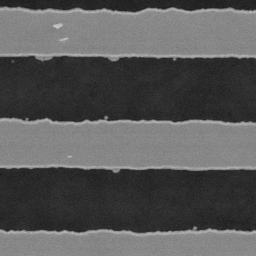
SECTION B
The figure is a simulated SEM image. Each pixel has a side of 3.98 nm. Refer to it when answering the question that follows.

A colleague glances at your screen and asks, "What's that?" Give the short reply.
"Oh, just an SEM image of lines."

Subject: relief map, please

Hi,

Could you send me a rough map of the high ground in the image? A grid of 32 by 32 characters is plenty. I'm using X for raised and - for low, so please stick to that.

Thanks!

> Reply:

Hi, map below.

--------------------------------
XXXXXXXXXXXXXXXX-XXXXXXXXXXXXXXX
XXXXXXXXXXXXXXXXXXXXXXXXXXXXXXXX
XXXXXXXXXXXXXXXXXXXXXXXXXXXXXXXX
XXXXXXXXXXXXXXXXXXXXXXXXXXXXXXXX
XXXXXXXXXXXXXXXXXXXXXXXXXXXXXXXX
XXXXXXXXXXXXXXXXXXXXXXXXXXXXXXXX
--------------------------------
--------------------------------
--------------------------------
--------------------------------
--------------------------------
--------------------------------
--------------------------------
--------------------------------
XXXXXXXXXXXXXXXXXXXXXXXXXXXXXXXX
XXXXXXXXXXXXXXXXXXXXXXXXXXXXXXXX
XXXXXXXXXXXXXXXXXXXXXXXXXXXXXXXX
XXXXXXXXXXXXXXXXXXXXXXXXXXXXXXXX
XXXXXXXXXXXXXXXXXXXXXXXXXXXXXXXX
XXXXXXXXXXXXXXXXXXXXXXXXXXXXXXXX
--------------------------------
--------------------------------
--------------------------------
--------------------------------
--------------------------------
--------------------------------
--------------------------------
--------------------------------
XXXXXXXXXXXXXXXXXXXXXXXXXXXXXXXX
XXXXXXXXXXXXXXXXXXXXXXXXXXXXXXXX
XXXXXXXXXXXXXXXXXXXXXXXXXXXXXXXX